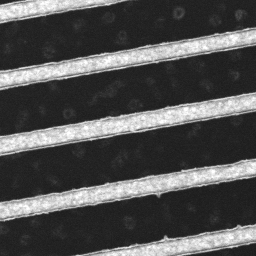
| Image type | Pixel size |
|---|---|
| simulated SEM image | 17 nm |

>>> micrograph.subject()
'one or a few lines or trenches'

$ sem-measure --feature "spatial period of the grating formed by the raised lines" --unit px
64.9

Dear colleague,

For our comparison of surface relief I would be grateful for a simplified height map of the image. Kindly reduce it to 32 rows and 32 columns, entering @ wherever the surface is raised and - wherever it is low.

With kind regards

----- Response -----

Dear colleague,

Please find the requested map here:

@------------@@@@@@@@@@@@@@@@@@@
--------@@@@@@@@@@@@@@@@@@@@@@@@
-@@@@@@@@@@@@@@@@@@@@@@@@@@@@@@@
@@@@@@@@@@@@@@@@@@@@@@@@@@@@@@@@
@@@@@@@@@@@@@@@@@@@@@@@@@@------
@@@@@@@@@@@@@@@@@@@@@-----------
@@@@@@@@@@@@@@@-----------@@@@@@
@@@@@@@@@------------@@@@@@@@@@@
@@@@-----------@@@@@@@@@@@@@@@@@
---------@@@@@@@@@@@@@@@@@@@@@@@
---@@@@@@@@@@@@@@@@@@@@@@@@@@@@@
@@@@@@@@@@@@@@@@@@@@@@@@@@@@@@@@
@@@@@@@@@@@@@@@@@@@@@@@@@@@-----
@@@@@@@@@@@@@@@@@@@@@-----------
@@@@@@@@@@@@@@@@------------@@@@
@@@@@@@@@@------------@@@@@@@@@@
@@@@-------------@@@@@@@@@@@@@@@
-----------@@@@@@@@@@@@@@@@@@@@@
-----@@@@@@@@@@@@@@@@@@@@@@@@@@@
@@@@@@@@@@@@@@@@@@@@@@@@@@@@@@@@
@@@@@@@@@@@@@@@@@@@@@@@@@@@@@---
@@@@@@@@@@@@@@@@@@@@@@@---------
@@@@@@@@@@@@@@@@@------------@@@
@@@@@@@@@@@------------@@@@@@@@@
@@@@@@-----------@@@@@@@@@@@@@@@
------------@@@@@@@@@@@@@@@@@@@@
-----@@@@@@@@@@@@@@@@@@@@@@@@@@@
@@@@@@@@@@@@@@@@@@@@@@@@@@@@@@@@
@@@@@@@@@@@@@@@@@@@@@@@@@@@@@---
@@@@@@@@@@@@@@@@@@@@@@@@@-------
@@@@@@@@@@@@@@@@@@@------------@
@@@@@@@@@@@@-------------@@@@@@@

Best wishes